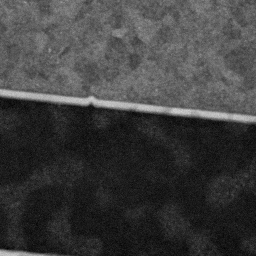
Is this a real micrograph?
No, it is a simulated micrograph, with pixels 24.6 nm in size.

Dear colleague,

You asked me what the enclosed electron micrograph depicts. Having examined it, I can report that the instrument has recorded one or a few lines or trenches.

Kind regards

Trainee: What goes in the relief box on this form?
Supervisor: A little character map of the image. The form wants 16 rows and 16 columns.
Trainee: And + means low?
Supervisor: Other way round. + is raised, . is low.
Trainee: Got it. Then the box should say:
++++++++++++++++
++++++++++++++++
++++++++++++++++
++++++++++++++++
++++++++++++++++
++++++++++++++++
.......+++++++++
................
................
................
................
................
................
................
................
................